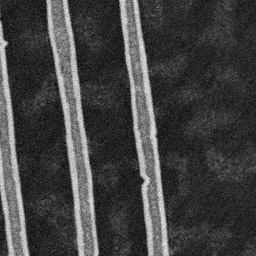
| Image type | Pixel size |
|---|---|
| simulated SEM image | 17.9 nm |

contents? one or a few lines or trenches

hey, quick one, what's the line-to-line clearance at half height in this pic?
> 0.976 microns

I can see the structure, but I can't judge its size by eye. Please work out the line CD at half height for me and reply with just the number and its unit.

275 nm